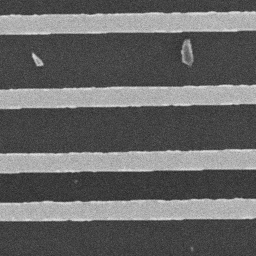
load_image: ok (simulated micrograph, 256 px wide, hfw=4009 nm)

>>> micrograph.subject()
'lines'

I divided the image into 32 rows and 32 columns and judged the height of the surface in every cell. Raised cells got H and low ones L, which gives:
LLLLLLLLLLLLLLLLLLLLLLLLLLLLLLLL
LLLLLLLLLLLLLLLLLLLLLLLLLLLLLLLL
HHHHHHHHHHHHHHHHHHHHHHHHHHHHHHHH
HHHHHHHHHHHHHHHHHHHHHHHHHHHHHHHH
LLLLLLLLLLLLLLLLLLLLLLLLLLLLLLLL
LLLLLLLLLLLLLLLLLLLLLLLLLLLLLLLL
LLLLLLLLLLLLLLLLLLLLLLLLLLLLLLLL
LLLLLLLLLLLLLLLLLLLLLLLLLLLLLLLL
LLLLLLLLLLLLLLLLLLLLLLLLLLLLLLLL
LLLLLLLLLLLLLLLLLLLLLLLLLLLLLLLL
LLLLLLLLLLLLLLLLLLLLLLLLLLLLLLLL
HHHHHHHHHHHHHHHHHHHHHHHHHHHHHHHH
HHHHHHHHHHHHHHHHHHHHHHHHHHHHHHHH
HHHLLLLLLLLLLLLLLLLLLLLLLLLLLLLL
LLLLLLLLLLLLLLLLLLLLLLLLLLLLLLLL
LLLLLLLLLLLLLLLLLLLLLLLLLLLLLLLL
LLLLLLLLLLLLLLLLLLLLLLLLLLLLLLLL
LLLLLLLLLLLLLLLLLLLLLLLLLLLLLLLL
LLLLLLLLLLLLLLLLLLLLLLLLLLLLLLLL
HHHHHHHHHHHHHHHHHHHHHHHHHHHHHHHH
HHHHHHHHHHHHHHHHHHHHHHHHHHHHHHHH
HHHLLLLLLLLLLLLLLLLLLLLLLLLLLLLL
LLLLLLLLLLLLLLLLLLLLLLLLLLLLLLLL
LLLLLLLLLLLLLLLLLLLLLLLLLLLLLLLL
LLLLLLLLLLLLLLLLLLLLLLLLLLLLLLLL
HHHHHHHHHHHHHHHHHHHHHHHHHHHHHHHH
HHHHHHHHHHHHHHHHHHHHHHHHHHHHHHHH
HHHHHHHHHHHHLLLLLLLLLLLLLLLLLLLL
LLLLLLLLLLLLLLLLLLLLLLLLLLLLLLLL
LLLLLLLLLLLLLLLLLLLLLLLLLLLLLLLL
LLLLLLLLLLLLLLLLLLLLLLLLLLLLLLLL
LLLLLLLLLLLLLLLLLLLLLLLLLLLLLLLL